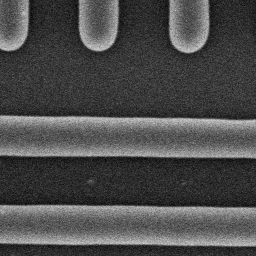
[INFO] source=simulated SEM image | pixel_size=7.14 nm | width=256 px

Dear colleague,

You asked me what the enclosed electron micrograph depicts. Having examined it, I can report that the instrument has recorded groups of lines, slits or small figures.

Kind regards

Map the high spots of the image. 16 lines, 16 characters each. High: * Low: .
**...**....**...
**...**....**...
*....**....**...
................
................
................
................
***************.
****************
****************
................
................
................
****************
****************
................